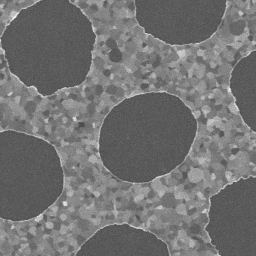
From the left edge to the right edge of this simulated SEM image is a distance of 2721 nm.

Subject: holes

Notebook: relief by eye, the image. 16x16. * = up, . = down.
**...***......**
*.....***.....**
......****...***
......*********.
*.....********..
**..**********..
*******.....***.
*******.....***.
..****......****
....**......****
....***....*****
....**********..
....*********...
..***********...
******...****...
*****.....***...